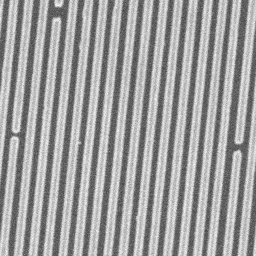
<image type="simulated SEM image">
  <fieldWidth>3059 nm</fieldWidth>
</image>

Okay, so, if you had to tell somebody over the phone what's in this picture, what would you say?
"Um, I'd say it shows parallel lines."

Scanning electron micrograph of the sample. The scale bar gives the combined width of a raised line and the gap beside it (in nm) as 178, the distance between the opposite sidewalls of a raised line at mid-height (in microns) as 0.0758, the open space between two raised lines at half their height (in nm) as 108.